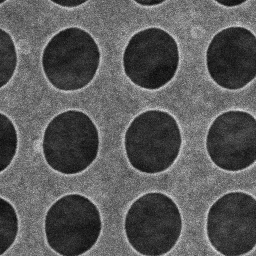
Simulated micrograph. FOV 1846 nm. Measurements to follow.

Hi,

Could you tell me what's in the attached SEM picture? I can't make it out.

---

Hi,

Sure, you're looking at holes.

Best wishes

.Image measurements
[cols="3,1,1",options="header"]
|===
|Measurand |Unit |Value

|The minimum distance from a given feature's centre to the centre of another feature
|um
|0.585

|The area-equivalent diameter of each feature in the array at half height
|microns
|0.434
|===